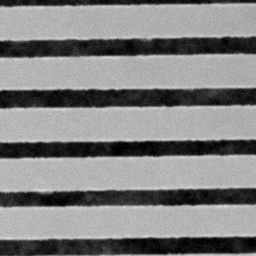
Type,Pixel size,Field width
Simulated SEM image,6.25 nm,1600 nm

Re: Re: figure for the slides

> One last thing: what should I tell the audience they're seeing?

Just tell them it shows lines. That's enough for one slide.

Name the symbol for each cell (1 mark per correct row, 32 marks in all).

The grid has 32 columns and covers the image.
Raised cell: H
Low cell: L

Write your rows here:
LLLLLLLLLLLLLLLLLLLLLLLLLLLLLLLL
HHHHHHHHHHHHHHHHHHHHHHHHHHHHHHHH
HHHHHHHHHHHHHHHHHHHHHHHHHHHHHHHH
HHHHHHHHHHHHHHHHHHHHHHHHHHHHHHHH
HHHHHHHHHHHHHHHHHHHHHHHHHHHHHHHH
LLLLLLLLLLLLLLLLLLLLLLLLLLLLLLLL
LLLLLLLLLLLLLLLLLLLLLLLLLLLLLLLL
HHHHHHHHHHHHHHHHHHHHHHHHHHHHHHHH
HHHHHHHHHHHHHHHHHHHHHHHHHHHHHHHH
HHHHHHHHHHHHHHHHHHHHHHHHHHHHHHHH
HHHHHHHHHHHHHHHHHHHHHHHHHHHHHHHH
LLLLLLLLLLLLLLLLLLLLLLLLLLLLLLLL
LLLLLLLLLLLLLLLLLLLLLLLLLLLLLLLL
LLLLLLLLLLLLLHHHHHHHHHHHHHHHHHHH
HHHHHHHHHHHHHHHHHHHHHHHHHHHHHHHH
HHHHHHHHHHHHHHHHHHHHHHHHHHHHHHHH
HHHHHHHHHHHHHHHHHHHHHHHHHHHHHHHH
HHHHHHHHHHHHHHHHHHHHHHHHHHHHLLLL
LLLLLLLLLLLLLLLLLLLLLLLLLLLLLLLL
LLLLLLLLLLLLLLLLLLLLLLLLLHHHHHHH
HHHHHHHHHHHHHHHHHHHHHHHHHHHHHHHH
HHHHHHHHHHHHHHHHHHHHHHHHHHHHHHHH
HHHHHHHHHHHHHHHHHHHHHHHHHHHHHHHH
HHHHHHHHHHHHHHHHHHHHHHHHHHHHHLLL
LLLLLLLLLLLLLLLLLLLLLLLLLLLLLLLL
LLLLLLLLLLLLLLLLLLLLLLLLLLLLLLLL
HHHHHHHHHHHHHHHHHHHHHHHHHHHHHHHH
HHHHHHHHHHHHHHHHHHHHHHHHHHHHHHHH
HHHHHHHHHHHHHHHHHHHHHHHHHHHHHHHH
HHHHHHHHHHHHHHHHHHHHHHHHHHHHHHHH
LLLLLLLLLLLLLLLLLLLLLLLLLLLLLLLL
LLLLLLLLLLLLLLLLLLLLLLLLLLLLLLLL